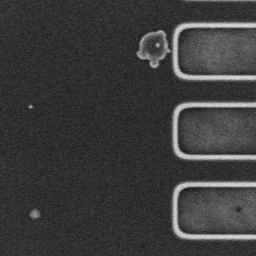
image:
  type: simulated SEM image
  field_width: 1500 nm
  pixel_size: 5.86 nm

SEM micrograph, groups of lines, slits or small figures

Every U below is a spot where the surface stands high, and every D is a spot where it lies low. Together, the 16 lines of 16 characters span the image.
UUUUUUUUUUUUUUUU
UUUUUUUUUUUUUUUU
UUUUUUUUUUUDDDDD
UUUUUUUUUUUDDDDD
UUUUUUUUUUUDDDDD
UUUUUUUUUUUUUUUU
UUUUUUUUUUUUUUUU
UUUUUUUUUUUDDDDD
UUUUUUUUUUUDDDDD
UUUUUUUUUUUDDDDD
UUUUUUUUUUUUUUUU
UUUUUUUUUUUUUUUU
UUUUUUUUUUUDDDDD
UUUUUUUUUUUDDDDD
UUUUUUUUUUUDDDDD
UUUUUUUUUUUUUUUU